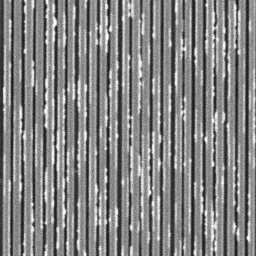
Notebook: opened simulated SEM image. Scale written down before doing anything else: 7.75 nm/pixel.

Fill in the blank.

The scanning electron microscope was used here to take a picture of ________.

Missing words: parallel lines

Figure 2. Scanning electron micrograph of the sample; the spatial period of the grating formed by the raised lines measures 10.6 pixels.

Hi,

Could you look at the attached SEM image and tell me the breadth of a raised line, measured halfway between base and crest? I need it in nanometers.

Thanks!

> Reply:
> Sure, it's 60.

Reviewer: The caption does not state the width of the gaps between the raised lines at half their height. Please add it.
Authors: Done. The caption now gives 23.2 nm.